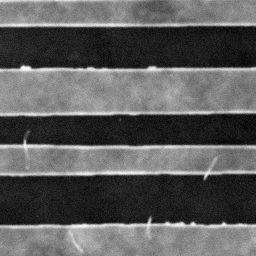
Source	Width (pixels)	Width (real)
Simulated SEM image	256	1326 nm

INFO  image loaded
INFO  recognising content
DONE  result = lines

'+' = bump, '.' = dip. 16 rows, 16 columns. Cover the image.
++++++++++++++++
++++++++++++++++
................
................
++++++++++++++++
++++++++++++++++
++++++++++++++++
................
................
++++++++++++++++
++++++++++++++++
................
................
................
++++++++++++++++
++++++++++++++++